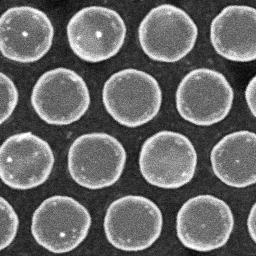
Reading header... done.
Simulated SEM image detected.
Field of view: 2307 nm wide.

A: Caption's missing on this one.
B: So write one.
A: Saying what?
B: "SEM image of a regular array of raised bodies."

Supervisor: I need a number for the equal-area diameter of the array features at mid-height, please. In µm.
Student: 0.507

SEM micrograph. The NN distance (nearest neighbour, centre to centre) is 644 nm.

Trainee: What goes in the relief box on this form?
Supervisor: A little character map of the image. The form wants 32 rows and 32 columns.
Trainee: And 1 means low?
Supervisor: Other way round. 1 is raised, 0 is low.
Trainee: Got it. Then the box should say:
00000000000000000000000000000000
01111000001111000001111000001111
11111100011111100011111100011111
11111100111111110111111110111111
11111110111111110111111110111111
11111100011111100011111100011111
11111100011111100011111100011111
00110000000110000000110000000110
00000000000000000000000000000000
10000111110000111110000111110000
11000111111001111111000111111001
11001111111001111111001111111001
11001111111001111111001111111001
11001111111001111111001111111001
10000111110000111110000111110000
00000000000000011100000001000000
00000000000000000000000000000010
01111000001111000011111000001111
11111100011111100011111100011111
11111110011111110011111100111111
11111110011111100111111100011111
11111100011111100011111100011111
11111100011111100011111100001111
00100000000100000000000000000000
00000000000000001000000001000000
10000111110000111110000111110000
11001111111001111111001111111001
11001111111001111111001111111001
11001111111001111111001111111001
11001111111001111111001111111001
10000111110000111110000111110000
00000001000000000000000000000000